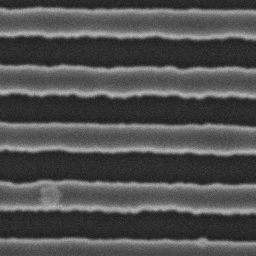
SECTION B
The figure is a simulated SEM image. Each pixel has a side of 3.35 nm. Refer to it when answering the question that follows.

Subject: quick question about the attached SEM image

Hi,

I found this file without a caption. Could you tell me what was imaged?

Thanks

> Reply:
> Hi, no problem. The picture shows lines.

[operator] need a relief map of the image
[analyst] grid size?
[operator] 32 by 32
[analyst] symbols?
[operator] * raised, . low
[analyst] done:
................................
********************************
********************************
********************************
......*.*.....*****.************
................................
................................
................................
***********......***.*......**..
********************************
********************************
********************************
................................
................................
................................
*...............................
********************************
********************************
********************************
................................
................................
................................
................................
********************************
********************************
********************************
........................*..**.*.
................................
................................
................................
********************************
********************************